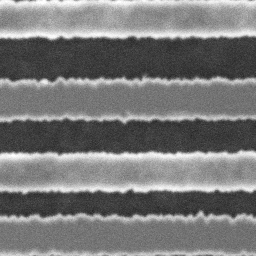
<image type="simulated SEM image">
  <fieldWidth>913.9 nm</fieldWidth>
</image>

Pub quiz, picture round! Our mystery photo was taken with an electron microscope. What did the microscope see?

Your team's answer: lines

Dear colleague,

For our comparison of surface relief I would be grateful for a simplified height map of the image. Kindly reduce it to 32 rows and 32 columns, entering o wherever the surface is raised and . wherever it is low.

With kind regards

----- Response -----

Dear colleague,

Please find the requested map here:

oooooooooooooooooooooooooooooooo
oooooooooooooooooooooooooooooooo
oooooooooooooooooooooooooooooooo
oooooooooooooooooooooooooooooooo
oooooooooooooooooooooooooooooo..
................................
................................
................................
................................
................................
oooooooooooooooooooooooooooooooo
oooooooooooooooooooooooooooooooo
oooooooooooooooooooooooooooooooo
oooooooooooooooooooooooooooooooo
oooooooooooooooooooooooooooooooo
................................
................................
................................
................................
oooooooooooooooooooooooooooooooo
oooooooooooooooooooooooooooooooo
oooooooooooooooooooooooooooooooo
oooooooooooooooooooooooooooooooo
oooooooooooooooooooooooooooooooo
................................
................................
................................
oooooooooooooooooooooooooooooooo
oooooooooooooooooooooooooooooooo
oooooooooooooooooooooooooooooooo
oooooooooooooooooooooooooooooooo
oooooooooooooooooooooooooooooooo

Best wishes